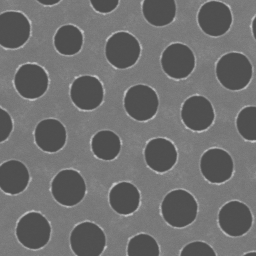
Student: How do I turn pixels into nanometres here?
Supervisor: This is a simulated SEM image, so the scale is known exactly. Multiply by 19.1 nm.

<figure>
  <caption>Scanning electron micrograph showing a regular array of holes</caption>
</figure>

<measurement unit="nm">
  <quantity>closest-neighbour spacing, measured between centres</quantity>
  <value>1060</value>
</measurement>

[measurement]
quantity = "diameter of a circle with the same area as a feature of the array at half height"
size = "652 nm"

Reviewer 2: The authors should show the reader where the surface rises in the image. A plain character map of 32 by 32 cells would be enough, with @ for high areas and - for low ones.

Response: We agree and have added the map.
@@@@@--@@@@----@@@----@@@@--@@@@
@-@@@@@@@@@@@-@@@@----@@@----@@@
---@@@@@@@@@@@@@@@----@@@----@@@
----@@@@--@@@@@@@@@@@@@@@----@@@
----@@@---@@@@---@@@@@@@@@@@@@@@
---@@@@---@@@----@@@@@-@@@@@@@@@
@@@@@@@---@@@-----@@----@@@@@@@@
@@@@@@@@@@@@@----@@@----@@@----@
@@@--@@@@@@@@@@-@@@@----@@@----@
@@----@@@@@@@@@@@@@@@--@@@@----@
@@----@@@----@@@@@@@@@@@@@@@---@
@@----@@@----@@@---@@@@@@@@@@@@@
@@@@@@@@@----@@@----@@@---@@@@@@
@@@@@@@@@@--@@@@----@@@----@@@@-
-@@@@@@@@@@@@@@@---@@@@----@@@--
-@@@@---@@@@@@@@@@@@@@@---@@@@--
-@@@----@@@@--@@@@@@@@@@@@@@@@--
@@@@----@@@@---@@@@--@@@@@@@@@@-
@@@@@---@@@@---@@@----@@@@@@@@@@
@@@@@@@@@@@@--@@@@----@@@----@@@
---@@@@@@@@@@@@@@@----@@@----@@@
----@@@@--@@@@@@@@@@@@@@@----@@@
----@@@---@@@@@@@@@@@@@@@@--@@@@
---@@@-----@@@---@@@@@@@@@@@@@@@
@@@@@@@---@@@@---@@@@---@@@@@@@@
@@@@@@@@-@@@@@---@@@-----@@@--@@
@@@@@@@@@@@@@@@--@@@-----@@----@
@@@---@@@@@@@@@@@@@@@---@@@----@
@@----@@@---@@@@@@@@@@@@@@@@---@
@@----@@@----@@@@--@@@@@@@@@@-@@
@@@---@@@----@@@----@@@@--@@@@@@
@@@@@@@@@----@@@----@@@----@@@@@